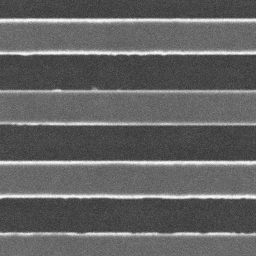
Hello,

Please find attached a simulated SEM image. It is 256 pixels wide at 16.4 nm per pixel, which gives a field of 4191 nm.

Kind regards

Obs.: lines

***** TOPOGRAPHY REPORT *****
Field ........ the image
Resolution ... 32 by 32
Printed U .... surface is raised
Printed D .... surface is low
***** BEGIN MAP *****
DDDDDDDDDDDDDDDDDDDDDDDDDDDDDDDD
DDDDDDDDDDDDDDDDDDDDDDDDDDDDDDDD
UUUUUUUUUUUUUUUUUUUUUUUUUUUUUUUU
UUUUUUUUUUUUUUUUUUUUUUUUUUUUUUUU
UUUUUUUUUUUUUUUUUUUUUUUUUUUUUUUU
UUUUUUUUUUUUUUUUUUUUUUUUUUUUUUUU
UUUUUUUUUUUUUUUUUUUUUUUUUUUUUUUU
DDDDDDDDDDDDDDDDDDDDDDDDDDDDDDDD
DDDDDDDDDDDDDDDDDDDDDDDDDDDDDDDD
DDDDDDDDDDDDDDDDDDDDDDDDDDDDDDDD
DDDDDDDDDDDDDDDDDDDDDDDDDDDDDDDD
UUUUUUUUUUUUUUUUUUUUUUUUUUUUUUUU
UUUUUUUUUUUUUUUUUUUUUUUUUUUUUUUU
UUUUUUUUUUUUUUUUUUUUUUUUUUUUUUUU
UUUUUUUUUUUUUUUUUUUUUUUUUUUUUUUU
DUUUUUUUUUUUUUUUUUUUUUUUUUUUUUUU
DDDDDDDDDDDDDDDDDDDDDDDDDDDDDDDD
DDDDDDDDDDDDDDDDDDDDDDDDDDDDDDDD
DDDDDDDDDDDDDDDDDDDDDDDDDDDDDDDD
DDDDDDDDDDDDDDDDDDDDDDDDDDDDDDDD
UUUUUUUUUUUUUUUUUUUUUUUUUUUUUUUU
UUUUUUUUUUUUUUUUUUUUUUUUUUUUUUUU
UUUUUUUUUUUUUUUUUUUUUUUUUUUUUUUU
UUUUUUUUUUUUUUUUUUUUUUUUUUUUUUUU
UUUUUUUUUUUUUUUUUUUUUUUUUUUUUUUU
DDDDDDDDDDDDDDDDDDDDDDDDDDDDDDDD
DDDDDDDDDDDDDDDDDDDDDDDDDDDDDDDD
DDDDDDDDDDDDDDDDDDDDDDDDDDDDDDDD
DDDDDDDDDDDDDDDDDDDDDDDDDDDDDDDD
UUUUUUUUUUUUUUUUUUUUUUUUUUUUUUUU
UUUUUUUUUUUUUUUUUUUUUUUUUUUUUUUU
UUUUUUUUUUUUUUUUUUUUUUUUUUUUUUUU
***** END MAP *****